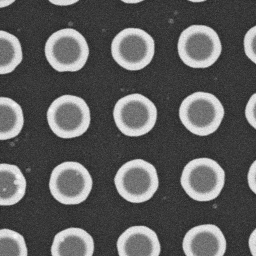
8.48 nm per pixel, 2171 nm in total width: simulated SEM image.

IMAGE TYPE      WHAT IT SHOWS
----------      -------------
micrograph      an array of small figures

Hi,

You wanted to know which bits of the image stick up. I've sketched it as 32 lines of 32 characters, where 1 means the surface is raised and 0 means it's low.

10000001100000000000000000000000
00000000000000000000000000000000
00000000000000000000000000000000
00000000000000000000000111000000
11000011110000011110000111100001
11000011111000111110001111110001
11100011111000111110001111110001
11100011111000111110000111100001
11000001110000001100000000000000
00000000000000000000000000000000
00000000000000000000000000000000
00000000000000000000000000000000
11000001110000011110000111100001
11100011111000111110000111110001
11100011111000111111001111110001
11100011111000011110000111100001
11000001111000011100000011100000
00000000000000000000000000000000
00000000000000000000000000000000
00000000000000000000000000000000
00000000110000001110000111100000
11100001111000011111000111110001
11100011111000111111000111110001
11100011111000011111000111110001
11100001111000011110000011100000
11000000000000000000000000000000
00000000000000000000000000000000
00000000000000000000000000000000
00000000000000001110000011100000
11100001111000011111000111110001
11100001111100011111000111110001
11100011111100011111000111110001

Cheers